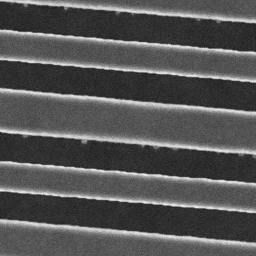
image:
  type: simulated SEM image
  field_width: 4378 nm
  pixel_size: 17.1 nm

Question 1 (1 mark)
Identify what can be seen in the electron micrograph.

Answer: lines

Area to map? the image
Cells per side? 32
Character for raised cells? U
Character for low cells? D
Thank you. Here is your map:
DDDDDDUUUUUUUUUUUUUUUUUUUUUUUUUU
DDDDDDDDDDDDDDDDUUUUUUUUUUUUUUUU
DDDDDDDDDDDDDDDDDDDDDDDDDDDDUUUU
DDDDDDDDDDDDDDDDDDDDDDDDDDDDDDDD
UUUUUUUUDDDDDDDDDDDDDDDDDDDDDDDD
UUUUUUUUUUUUUUUUUUUUDDDDDDDDDDDD
UUUUUUUUUUUUUUUUUUUUUUUUUUUUUUDD
DUUUUUUUUUUUUUUUUUUUUUUUUUUUUUUU
DDDDDDDDDDDDDUUUUUUUUUUUUUUUUUUU
DDDDDDDDDDDDDDDDDDDDDDDUUUUUUUUU
DDDDDDDDDDDDDDDDDDDDDDDDDDDDDDDD
UUUUDDDDDDDDDDDDDDDDDDDDDDDDDDDD
UUUUUUUUUUUUUUUDDDDDDDDDDDDDDDDD
UUUUUUUUUUUUUUUUUUUUUUUUUDDDDDDD
UUUUUUUUUUUUUUUUUUUUUUUUUUUUUUUU
UUUUUUUUUUUUUUUUUUUUUUUUUUUUUUUU
UUUUUUUUUUUUUUUUUUUUUUUUUUUUUUUU
DDDDDDDDDDDDDUUUUUUUUUUUUUUUUUUU
DDDDDDDDDDDDDDDDDDDDDDDDUUUUUUUU
DDDDDDDDDDDDDDDDDDDDDDDDDDDDDDDD
UUUUDDDDDDDDDDDDDDDDDDDDDDDDDDDD
UUUUUUUUUUUUUUUDDDDDDDDDDDDDDDDD
UUUUUUUUUUUUUUUUUUUUUUUUUUUDDDDD
UUUUUUUUUUUUUUUUUUUUUUUUUUUUUUUU
DDDDDDDUUUUUUUUUUUUUUUUUUUUUUUUU
DDDDDDDDDDDDDDDDDDDDUUUUUUUUUUUU
DDDDDDDDDDDDDDDDDDDDDDDDDDDDDDDU
DDDDDDDDDDDDDDDDDDDDDDDDDDDDDDDD
UUUUUUUUUUDDDDDDDDDDDDDDDDDDDDDD
UUUUUUUUUUUUUUUUUUUUUDDDDDDDDDDD
UUUUUUUUUUUUUUUUUUUUUUUUUUUUUUUU
UUUUUUUUUUUUUUUUUUUUUUUUUUUUUUUU